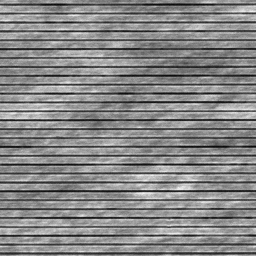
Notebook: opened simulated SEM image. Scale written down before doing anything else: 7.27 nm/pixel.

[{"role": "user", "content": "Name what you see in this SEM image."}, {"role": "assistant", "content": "parallel lines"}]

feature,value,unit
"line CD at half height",43.6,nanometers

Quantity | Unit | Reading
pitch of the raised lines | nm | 64.7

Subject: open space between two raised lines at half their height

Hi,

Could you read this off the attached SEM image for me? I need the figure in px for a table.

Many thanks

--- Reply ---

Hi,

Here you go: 2.63